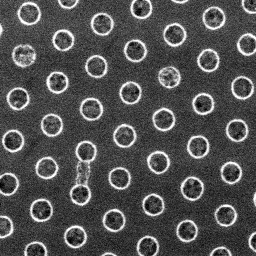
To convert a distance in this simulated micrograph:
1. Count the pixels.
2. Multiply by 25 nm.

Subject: a regular array of raised bodies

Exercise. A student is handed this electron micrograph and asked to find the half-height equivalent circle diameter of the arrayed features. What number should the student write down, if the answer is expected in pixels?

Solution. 20.7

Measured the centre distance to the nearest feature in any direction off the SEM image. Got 1050 nm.